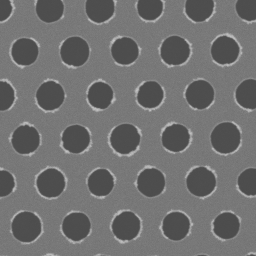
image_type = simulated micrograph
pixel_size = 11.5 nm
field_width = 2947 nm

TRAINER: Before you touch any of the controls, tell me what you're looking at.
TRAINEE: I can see a regular array of holes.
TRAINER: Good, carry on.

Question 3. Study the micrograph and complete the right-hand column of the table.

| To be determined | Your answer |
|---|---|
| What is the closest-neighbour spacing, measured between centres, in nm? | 574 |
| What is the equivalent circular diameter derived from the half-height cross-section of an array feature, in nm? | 331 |